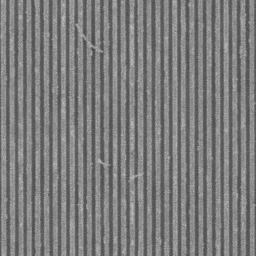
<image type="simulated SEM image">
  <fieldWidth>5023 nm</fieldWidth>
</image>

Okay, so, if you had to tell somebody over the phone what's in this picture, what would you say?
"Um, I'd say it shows parallel lines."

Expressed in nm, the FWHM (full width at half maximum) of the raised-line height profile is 85.8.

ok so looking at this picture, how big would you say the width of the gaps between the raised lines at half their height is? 85.8 nanometers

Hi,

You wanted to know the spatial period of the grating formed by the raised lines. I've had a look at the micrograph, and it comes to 168 nm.